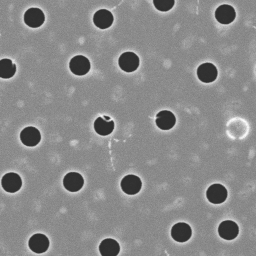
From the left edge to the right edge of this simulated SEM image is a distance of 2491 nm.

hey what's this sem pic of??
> a regular array of holes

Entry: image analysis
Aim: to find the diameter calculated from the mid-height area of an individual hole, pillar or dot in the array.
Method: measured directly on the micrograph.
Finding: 202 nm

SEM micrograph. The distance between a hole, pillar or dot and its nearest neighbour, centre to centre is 523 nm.